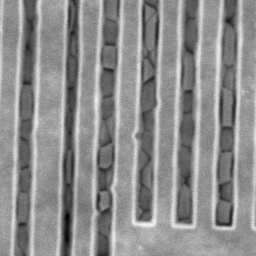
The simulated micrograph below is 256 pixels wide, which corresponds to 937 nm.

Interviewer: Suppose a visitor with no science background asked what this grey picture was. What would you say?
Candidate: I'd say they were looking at parallel lines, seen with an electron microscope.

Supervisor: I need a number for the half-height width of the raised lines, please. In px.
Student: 22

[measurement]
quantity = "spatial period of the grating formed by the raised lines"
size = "143 nanometers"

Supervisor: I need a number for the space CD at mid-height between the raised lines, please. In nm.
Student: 64.4